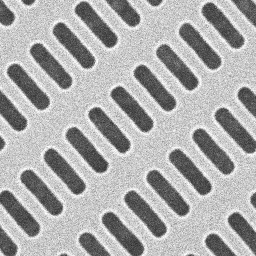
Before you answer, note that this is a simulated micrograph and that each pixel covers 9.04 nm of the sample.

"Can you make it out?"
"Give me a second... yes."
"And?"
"a regular array of holes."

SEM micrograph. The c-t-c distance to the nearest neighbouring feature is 277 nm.